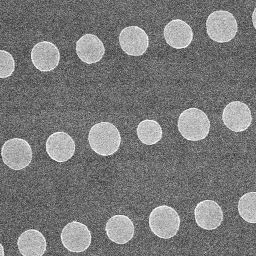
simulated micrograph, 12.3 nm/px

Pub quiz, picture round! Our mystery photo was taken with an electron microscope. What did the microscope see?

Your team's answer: a regular array of raised bodies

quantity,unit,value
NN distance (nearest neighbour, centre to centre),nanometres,547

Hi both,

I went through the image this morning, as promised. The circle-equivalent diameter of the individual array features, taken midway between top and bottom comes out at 28.7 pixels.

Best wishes